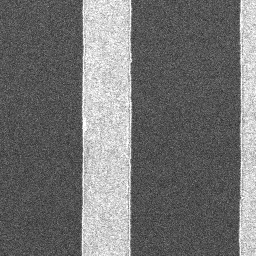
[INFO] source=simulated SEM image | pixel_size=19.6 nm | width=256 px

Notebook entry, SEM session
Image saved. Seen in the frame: one or a few lines or trenches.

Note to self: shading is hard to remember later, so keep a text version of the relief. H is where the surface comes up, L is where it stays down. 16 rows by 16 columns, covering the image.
HHHHHLLLHHHHHHHL
HHHHHLLLHHHHHHHL
HHHHHLLLHHHHHHHL
HHHHHLLLHHHHHHHL
HHHHHLLLHHHHHHHL
HHHHHLLLHHHHHHHL
HHHHHLLLHHHHHHHH
HHHHHLLLHHHHHHHL
HHHHHLLLHHHHHHHL
HHHHHLLLHHHHHHHL
HHHHHLLLHHHHHHHL
HHHHHLLLHHHHHHHL
HHHHHLLLHHHHHHHL
HHHHHLLLHHHHHHHL
HHHHHLLLHHHHHHHL
HHHHHLLLHHHHHHHL